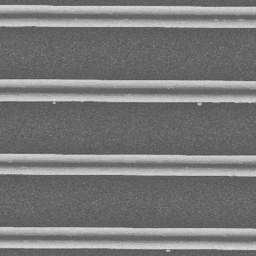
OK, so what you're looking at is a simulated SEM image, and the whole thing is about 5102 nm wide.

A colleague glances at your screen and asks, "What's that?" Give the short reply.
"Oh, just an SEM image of lines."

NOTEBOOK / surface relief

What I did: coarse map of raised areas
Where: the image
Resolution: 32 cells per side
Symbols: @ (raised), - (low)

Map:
--------------------------------
@@@@@@@@@@@@@@@@@@@@@@@@@@@@@@@@
@@@@@@@@@@@@@@@@@@@@@@@@@@@@@@@@
--------------------------------
--------------------------------
--------------------------------
--------------------------------
--------------------------------
--------------------------------
--------------------------------
@@@@@@@@@@@@@@@@@@@@@@@@@@@@@@@@
@@@@@@@@@@@@@@@@@@@@@@@@@@@@@@@@
--------------------------------
--------------------------------
--------------------------------
--------------------------------
--------------------------------
--------------------------------
--------------------------------
--------------------------------
@@@@@@@@@@@@@@@@@@@@@@@@@@@@@@@@
---@@@@@@@@@@@@@@@@@@@@@@@@@@@@@
--------------------------------
--------------------------------
--------------------------------
--------------------------------
--------------------------------
--------------------------------
--------------------------------
@@@@@@@@@@@@@@@@@@@@@@@@@@@@@@@@
@@@@@@@@@@@@@@@@@@@@@@@@@@@@@@@@
--------------------------------